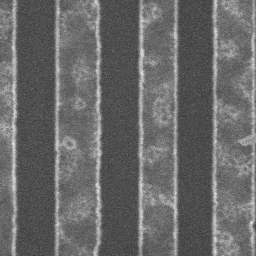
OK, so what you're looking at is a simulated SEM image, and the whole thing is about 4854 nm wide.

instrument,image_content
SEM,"one or a few lines or trenches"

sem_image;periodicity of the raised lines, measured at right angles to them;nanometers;1480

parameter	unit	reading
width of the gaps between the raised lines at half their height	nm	794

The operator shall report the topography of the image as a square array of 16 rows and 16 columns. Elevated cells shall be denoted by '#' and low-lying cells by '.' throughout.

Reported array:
#...##...##..###
#...##...##..###
#...##...##..###
#...##...##..###
#...##...##..###
#...##...##..###
#...##...##..###
#...##...##..###
#...##...##..###
#...##...##..###
#...##...##..###
#...##...##..###
#...##...##..###
#...##...##..###
#...##...##..###
#...##...##..###